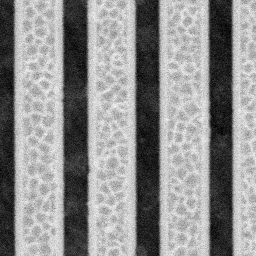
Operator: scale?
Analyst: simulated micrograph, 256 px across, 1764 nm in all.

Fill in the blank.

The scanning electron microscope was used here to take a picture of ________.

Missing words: one or a few lines or trenches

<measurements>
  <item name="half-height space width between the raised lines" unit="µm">0.224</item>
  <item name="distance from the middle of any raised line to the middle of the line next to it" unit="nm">500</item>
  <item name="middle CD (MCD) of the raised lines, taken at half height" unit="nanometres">273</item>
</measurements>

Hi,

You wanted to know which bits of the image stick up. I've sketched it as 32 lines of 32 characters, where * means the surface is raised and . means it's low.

..*****.....****.....****.....**
..*****.....****.....****.....**
..*****.....****.....****.....**
...****.....****.....****.....**
...****.....****.....****.....**
...****.....****.....****.....**
..*****.....****.....****.....**
..*****.....****.....****.....**
..*****.....****.....****.....**
...****.....****.....****.....**
..*****.....****.....****.....**
..*****.....****.....****.....**
..*****.....****.....*****....**
..*****.....****.....*****....**
..*****.....****.....*****....**
..*****.....****.....*****....**
..*****.....****.....*****....**
...****.....****.....*****....**
...****.....****.....*****....**
...****.....****.....*****....**
...****.....****.....*****....**
...****.....****.....*****....**
..*****.....****.....*****....**
..*****.....****.....*****....**
...****.....****.....*****....**
...****.....****.....*****....**
..*****.....****.....*****....**
..*****.....****....******....**
..*****.....****.....*****....**
..*****.....****.....*****....**
...****.....****.....*****....**
...****.....****.....*****....**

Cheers